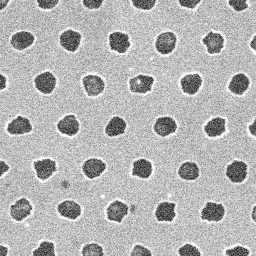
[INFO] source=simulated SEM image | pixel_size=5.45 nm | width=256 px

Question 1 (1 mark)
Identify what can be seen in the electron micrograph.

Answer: a regular array of holes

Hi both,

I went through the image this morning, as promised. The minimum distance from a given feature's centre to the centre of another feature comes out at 0.258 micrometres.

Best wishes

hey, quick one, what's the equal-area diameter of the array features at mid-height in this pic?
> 22.3 pixels